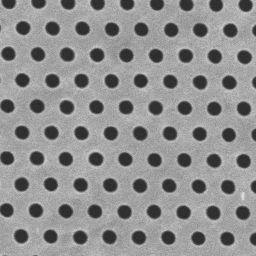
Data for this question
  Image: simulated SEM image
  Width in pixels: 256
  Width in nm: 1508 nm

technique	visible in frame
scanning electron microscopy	a regular array of holes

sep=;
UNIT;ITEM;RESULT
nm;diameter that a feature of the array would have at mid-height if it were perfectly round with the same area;80.9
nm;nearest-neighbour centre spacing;173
